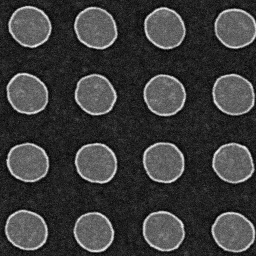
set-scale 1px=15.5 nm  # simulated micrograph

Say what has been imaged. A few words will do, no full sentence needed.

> a regular array of raised bodies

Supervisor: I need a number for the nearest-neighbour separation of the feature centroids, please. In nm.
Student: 1040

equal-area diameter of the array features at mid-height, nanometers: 618